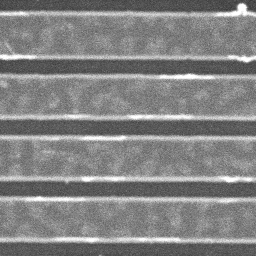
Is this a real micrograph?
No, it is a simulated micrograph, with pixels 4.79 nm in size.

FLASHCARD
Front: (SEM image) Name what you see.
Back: one or a few lines or trenches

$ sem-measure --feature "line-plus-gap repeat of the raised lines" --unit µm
0.294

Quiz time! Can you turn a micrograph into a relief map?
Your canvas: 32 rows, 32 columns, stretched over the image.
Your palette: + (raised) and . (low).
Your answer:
................................
.............................++.
++++++++++++++++++++++++++++++++
++++++++++++++++++++++++++++++++
++++++++++++++++++++++++++++++++
++++++++++++++++++++++++++++++++
++++++++++++++++++++++++++++++++
..............................+.
................................
+++++++..........+..+++++.......
++++++++++++++++++++++++++++++++
++++++++++++++++++++++++++++++++
++++++++++++++++++++++++++++++++
++++++++++++++++++++++++++++++++
++++++++++++++++++++++++++++++++
................................
................................
++++++++++++++++++++++++++++++++
++++++++++++++++++++++++++++++++
++++++++++++++++++++++++++++++++
++++++++++++++++++++++++++++++++
++++++++++++++++++++++++++++++++
..........++................++++
................................
................................
++++++++++++++++++++++++++++++++
++++++++++++++++++++++++++++++++
++++++++++++++++++++++++++++++++
++++++++++++++++++++++++++++++++
++++++++++++++++++++++++++++++++
................................
................................